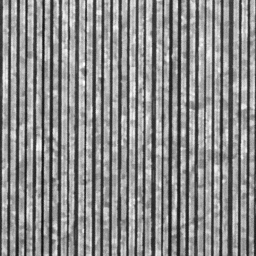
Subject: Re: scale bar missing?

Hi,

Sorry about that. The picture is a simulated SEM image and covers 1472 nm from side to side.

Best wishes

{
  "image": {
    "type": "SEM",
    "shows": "parallel lines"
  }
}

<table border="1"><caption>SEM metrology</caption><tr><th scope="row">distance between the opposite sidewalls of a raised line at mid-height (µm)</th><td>0.0273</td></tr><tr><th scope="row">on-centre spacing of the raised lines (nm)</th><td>48.9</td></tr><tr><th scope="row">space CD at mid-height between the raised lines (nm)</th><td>22.3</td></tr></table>